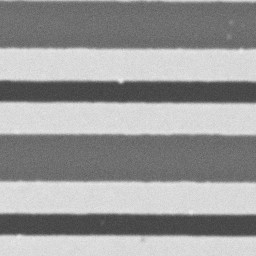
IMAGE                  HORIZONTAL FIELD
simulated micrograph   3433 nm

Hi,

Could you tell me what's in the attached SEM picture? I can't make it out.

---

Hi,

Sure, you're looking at lines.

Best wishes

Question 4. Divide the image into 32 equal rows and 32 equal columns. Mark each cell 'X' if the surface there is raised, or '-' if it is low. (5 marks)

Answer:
--------------------------------
--------------------------------
--------------------------------
--------------------------------
--------------------------------
--------------------------------
XXXXXXXXXXXXXXXXXXXXXXXXXXXXXXXX
XXXXXXXXXXXXXXXXXXXXXXXXXXXXXXXX
XXXXXXXXXXXXXXXXXXXXXXXXXXXXXXXX
XXXXXXXXXXXXXXXXXXXXXXXXXXXXXXXX
--------------------------------
--------------------------------
--------------------------------
XXXXXXXXXXXXXXXXXXXXXXXXXXXXXXXX
XXXXXXXXXXXXXXXXXXXXXXXXXXXXXXXX
XXXXXXXXXXXXXXXXXXXXXXXXXXXXXXXX
XXXXXXXXXXXXXXXXXXXXXXXXXXXXXXXX
--------------------------------
--------------------------------
--------------------------------
--------------------------------
--------------------------------
--------------------------------
XXXXXXXXXXXXXXXXXXXXXXXXXXXXXXXX
XXXXXXXXXXXXXXXXXXXXXXXXXXXXXXXX
XXXXXXXXXXXXXXXXXXXXXXXXXXXXXXXX
XXXXXXXXXXXXXXXXXXXXXXXXXXXXXXXX
--------------------------------
--------------------------------
XXX-----------------------------
XXXXXXXXXXXXXXXXXXXXXXXXXXXXXXXX
XXXXXXXXXXXXXXXXXXXXXXXXXXXXXXXX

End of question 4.